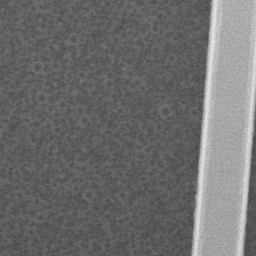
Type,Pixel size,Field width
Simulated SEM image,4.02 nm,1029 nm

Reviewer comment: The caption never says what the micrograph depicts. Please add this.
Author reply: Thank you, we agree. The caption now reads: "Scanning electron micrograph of one or a few lines or trenches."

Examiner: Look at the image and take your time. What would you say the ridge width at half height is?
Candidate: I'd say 45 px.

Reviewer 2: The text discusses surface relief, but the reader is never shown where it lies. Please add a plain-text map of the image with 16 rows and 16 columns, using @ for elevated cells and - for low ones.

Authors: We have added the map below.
-------------@@@
-------------@@@
-------------@@@
-------------@@@
-------------@@@
-------------@@@
-------------@@@
-------------@@@
-------------@@@
-------------@@@
-------------@@-
-------------@@-
------------@@@-
------------@@@-
------------@@@-
------------@@@-